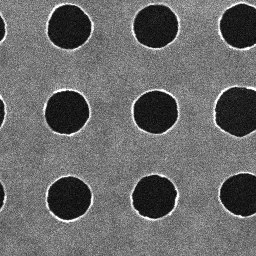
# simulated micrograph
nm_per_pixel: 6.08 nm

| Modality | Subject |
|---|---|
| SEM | holes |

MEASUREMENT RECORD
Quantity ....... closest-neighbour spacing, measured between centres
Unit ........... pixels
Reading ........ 85.1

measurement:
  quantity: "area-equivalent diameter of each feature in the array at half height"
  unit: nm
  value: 268